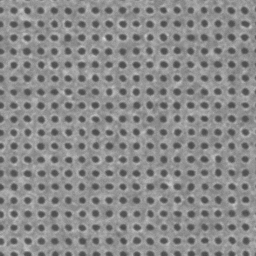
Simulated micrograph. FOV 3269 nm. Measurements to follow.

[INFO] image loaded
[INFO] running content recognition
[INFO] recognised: a regular array of holes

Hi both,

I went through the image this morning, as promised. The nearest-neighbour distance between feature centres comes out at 168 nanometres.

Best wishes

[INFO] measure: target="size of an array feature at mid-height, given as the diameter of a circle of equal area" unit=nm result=104